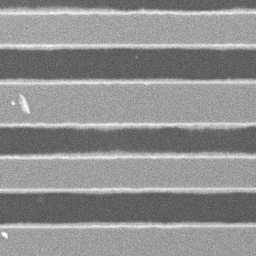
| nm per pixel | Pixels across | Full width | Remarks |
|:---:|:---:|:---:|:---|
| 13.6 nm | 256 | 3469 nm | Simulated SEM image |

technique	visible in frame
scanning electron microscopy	lines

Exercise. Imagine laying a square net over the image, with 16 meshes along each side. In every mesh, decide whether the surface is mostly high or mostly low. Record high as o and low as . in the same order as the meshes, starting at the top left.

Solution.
................
oooooooooooooooo
oooooooooooooooo
................
................
oooooooooooooooo
oooooooooooooooo
oooooooooooooooo
................
................
oooooooooooooooo
oooooooooooooooo
................
................
oooooooooooooooo
oooooooooooooooo